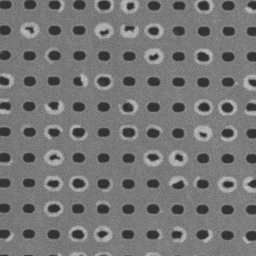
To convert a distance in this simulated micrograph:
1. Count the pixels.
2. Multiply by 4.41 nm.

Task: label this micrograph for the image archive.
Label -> a regular array of holes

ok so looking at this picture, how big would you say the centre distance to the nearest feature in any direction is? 24.6 px